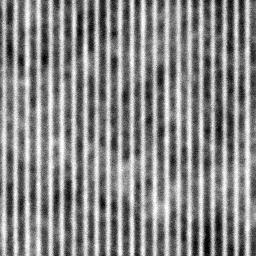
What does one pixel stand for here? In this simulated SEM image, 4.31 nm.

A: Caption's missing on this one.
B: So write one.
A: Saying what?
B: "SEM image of parallel lines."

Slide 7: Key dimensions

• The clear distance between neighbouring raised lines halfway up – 41 nm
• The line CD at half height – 8.6 nm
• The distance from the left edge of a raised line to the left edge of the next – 50 nm